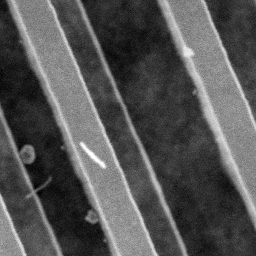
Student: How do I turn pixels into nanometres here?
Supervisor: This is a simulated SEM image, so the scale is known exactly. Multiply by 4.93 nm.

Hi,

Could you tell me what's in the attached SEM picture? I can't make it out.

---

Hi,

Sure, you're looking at lines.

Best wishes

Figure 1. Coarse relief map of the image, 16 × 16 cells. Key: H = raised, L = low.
LHHHHLLLLLHHHHHH
LHHHHHLLLLLHHHHH
LLHHHHLLLLLHHHHH
LLHHHHLLLLLLHHHH
LLLHHHHLLLLLHHHH
LLLHHHHLLLLLLHHH
LLLHHHHHLLLLLHHH
LLLLHHHHLLLLLHHH
HLLLHHHHHLLLLLHH
HLLLLHHHHLLLLLHH
HLLLLHHHHLLLLLLH
HHLLLLHHHHLLLLLH
HHLLLLHHHHLLLLLL
HHHLLLHHHHHLLLLL
HHHLLLLHHHHLLLLL
HHHHLLLHHHHLLLLL